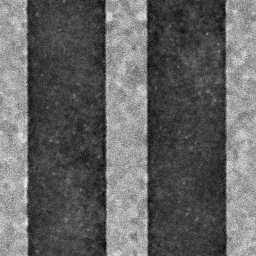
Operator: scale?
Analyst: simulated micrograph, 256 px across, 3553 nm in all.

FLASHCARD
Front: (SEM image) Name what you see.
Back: one or a few lines or trenches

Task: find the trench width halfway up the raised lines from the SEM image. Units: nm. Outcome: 1120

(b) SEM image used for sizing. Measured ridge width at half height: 552 nm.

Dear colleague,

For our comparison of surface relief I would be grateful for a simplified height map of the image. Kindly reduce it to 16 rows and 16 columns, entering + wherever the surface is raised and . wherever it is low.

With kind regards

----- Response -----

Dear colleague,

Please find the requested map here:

++.....++.....++
++.....++.....++
++.....++.....++
++.....++.....++
++.....++.....++
++.....++.....++
++.....++.....++
++.....++.....++
++.....++.....++
++.....++.....++
++.....++.....++
++.....++.....++
++.....++.....++
++.....++.....++
++.....++.....++
++.....++.....++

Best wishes